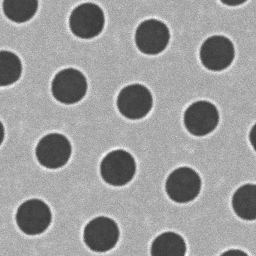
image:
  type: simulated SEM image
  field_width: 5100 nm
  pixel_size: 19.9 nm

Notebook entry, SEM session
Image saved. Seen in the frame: a regular array of holes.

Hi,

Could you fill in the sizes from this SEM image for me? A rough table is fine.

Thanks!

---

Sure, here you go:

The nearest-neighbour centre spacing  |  1.34 um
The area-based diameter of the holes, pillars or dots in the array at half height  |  0.736 µm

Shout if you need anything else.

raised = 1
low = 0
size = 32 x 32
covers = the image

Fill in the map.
00000111110011111111111111110011
00000111100001111111111111111111
10001111100001111100111111111111
11111111100001111000011111111111
11111111100011111000011111001111
11111111111111111000011110000111
00111111111111111100111110000111
00011111111111111111111110000111
00011111011111111111111111001111
00011110000111111111111111111111
00111100000111111111111111111111
11111100000111100001111111111111
11111110001111100001111111111111
11111111111111100001111000011111
11111111111111100011111000011111
11111111111111111111111000011111
01111111111111111111111100111110
11111000011111111111111111111110
11110000011111111111111111111111
11110000011110000111111111111111
11111000111110000111111111111111
11111111111100000111100001111111
11111111111110001111100001111111
11111111111111111111100001111100
11111111111111111111100001111000
11100011111111111111111111111000
11000011111111111111111111111000
11000011111000111111111111111110
11000011110000011111111111111111
11111111110000011111000111111111
11111111111000011110000111111111
11111111111101111110000111110001